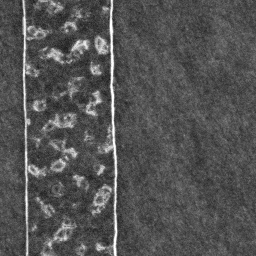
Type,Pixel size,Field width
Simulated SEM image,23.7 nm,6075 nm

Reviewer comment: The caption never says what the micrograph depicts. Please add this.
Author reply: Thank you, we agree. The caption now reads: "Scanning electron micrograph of one or a few lines or trenches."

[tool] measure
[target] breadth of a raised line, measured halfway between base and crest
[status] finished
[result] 2100 nm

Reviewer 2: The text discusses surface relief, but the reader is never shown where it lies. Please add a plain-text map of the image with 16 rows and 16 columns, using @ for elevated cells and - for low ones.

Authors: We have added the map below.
-@@@@@@---------
--@@@@@---------
--@@@@@---------
--@@@@@---------
--@@@@@---------
--@@@@@---------
--@@@@@---------
--@@@@@---------
--@@@@@---------
--@@@@@---------
--@@@@@---------
--@@@@@---------
--@@@@@---------
--@@@@@---------
--@@@@@---------
--@@@@@---------